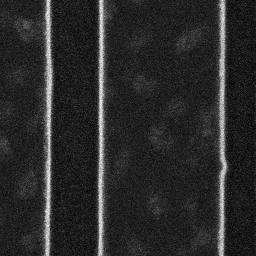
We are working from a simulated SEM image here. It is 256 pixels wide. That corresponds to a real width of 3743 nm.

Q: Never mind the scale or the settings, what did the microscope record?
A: one or a few lines or trenches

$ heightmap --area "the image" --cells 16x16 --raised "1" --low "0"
1110001111111100
1110001111111100
1110001111111100
1110001111111100
1110001111111100
1110001111111100
1110001111111100
1110001111111100
1110001111111100
1110001111111100
1110001111111100
1110001111111100
1110001111111100
1110001111111100
1110001111111100
1110001111111100